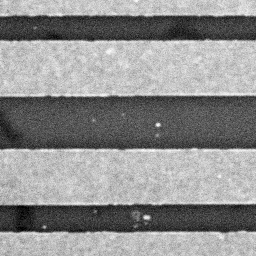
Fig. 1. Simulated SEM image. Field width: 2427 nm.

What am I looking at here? lines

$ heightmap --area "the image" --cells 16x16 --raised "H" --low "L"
HHHHHHHHHHHHHHHH
LLLLLLLLLLLLLLLL
LLLLLLLLLLLLLLLL
HHHHHHHHHHHHHHHH
HHHHHHHHHHHHHHHH
HHHHHHHHHHHHHHHH
LLLLLLLLLLLLLLLL
LLLLLLLLLLLLLLLL
LLLLLLLLLLLLLLLL
HHHHHHHHHHHHHHHH
HHHHHHHHHHHHHHHH
HHHHHHHHHHHHHHHH
HHHHHHHHHHHHHHHH
LLLLLLLLLLLLLLLL
LLLLLLLLLLLLLLLH
HHHHHHHHHHHHHHHH